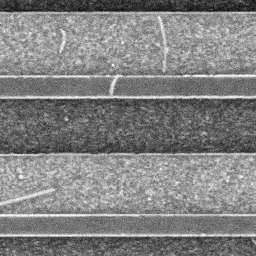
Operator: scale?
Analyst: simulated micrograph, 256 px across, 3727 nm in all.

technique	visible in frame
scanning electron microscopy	lines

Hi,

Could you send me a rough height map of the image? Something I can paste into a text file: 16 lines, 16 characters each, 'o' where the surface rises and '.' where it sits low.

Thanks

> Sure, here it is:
................
oooooooooooooooo
oooooooooooooooo
oooooooooooooooo
oooooooooooooooo
oooooooooooooooo
................
................
................
................
oooooooooooooooo
oooooooooooooooo
oooooooooooooooo
oooooooooooooooo
oooooooooooooooo
................